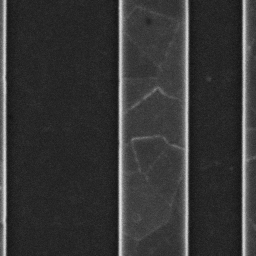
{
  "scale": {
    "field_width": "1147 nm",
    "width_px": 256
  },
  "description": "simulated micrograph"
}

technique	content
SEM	one or a few lines or trenches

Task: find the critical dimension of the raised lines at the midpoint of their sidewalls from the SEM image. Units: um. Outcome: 0.305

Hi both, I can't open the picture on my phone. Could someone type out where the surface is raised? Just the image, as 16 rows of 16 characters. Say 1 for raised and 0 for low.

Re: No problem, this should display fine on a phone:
0000000011110001
0000000011110001
0000000011110001
0000000011110001
0000000011110001
0000000011110001
0000000011110001
0000000011110001
0000000011110001
0000000011110001
0000000011110001
0000000011110001
0000000011110001
0000000011110001
0000000011110001
0000000011110001